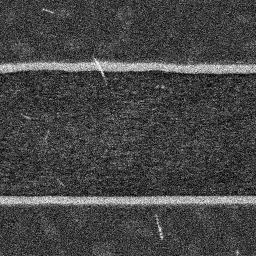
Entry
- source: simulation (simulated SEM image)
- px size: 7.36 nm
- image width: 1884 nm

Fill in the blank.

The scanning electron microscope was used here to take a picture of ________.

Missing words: one or a few lines or trenches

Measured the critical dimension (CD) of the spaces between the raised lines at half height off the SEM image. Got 963 nm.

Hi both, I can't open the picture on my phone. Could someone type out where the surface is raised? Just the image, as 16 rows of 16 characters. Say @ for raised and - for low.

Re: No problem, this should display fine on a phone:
@@@@@@@@@@@@@@@@
@@@@@@@@@@@@@@@@
@@@@@@@@@@@@@@@@
@@@@@@@@@@@@@@@@
----------------
----------------
----------------
----------------
----------------
----------------
----------------
----------------
@@@@@@@@@@@@@@@@
@@@@@@@@@@@@@@@@
@@@@@@@@@@@@@@@@
@@@@@@@@@@@@@@@@